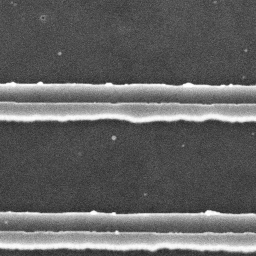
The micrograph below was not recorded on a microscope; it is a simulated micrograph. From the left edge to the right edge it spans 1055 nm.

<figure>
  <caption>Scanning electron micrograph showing lines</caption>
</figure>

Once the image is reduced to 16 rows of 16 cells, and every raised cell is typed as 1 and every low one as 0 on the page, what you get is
0000000000000000
0000000000000000
0000000000000000
0000000000000000
0000000000000000
1111111111111111
1111111111111111
0000000000000000
0000000000000000
0000000000000000
0000000000000000
0000000000000000
0000000000000000
1111111111111111
1111111111111111
0000000000000001